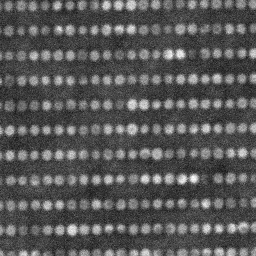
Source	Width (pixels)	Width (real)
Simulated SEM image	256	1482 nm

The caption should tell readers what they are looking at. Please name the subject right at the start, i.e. a regular array of raised bodies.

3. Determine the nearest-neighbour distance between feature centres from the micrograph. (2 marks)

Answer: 70.1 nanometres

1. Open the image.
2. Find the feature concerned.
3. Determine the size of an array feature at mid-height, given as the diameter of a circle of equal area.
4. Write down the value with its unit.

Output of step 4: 45.7 nm